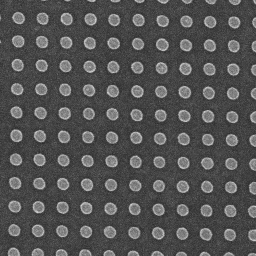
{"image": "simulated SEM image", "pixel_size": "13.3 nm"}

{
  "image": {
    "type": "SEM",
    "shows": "a regular array of raised bodies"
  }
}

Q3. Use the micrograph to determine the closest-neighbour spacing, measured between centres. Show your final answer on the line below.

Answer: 311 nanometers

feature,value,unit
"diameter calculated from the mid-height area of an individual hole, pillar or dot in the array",153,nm